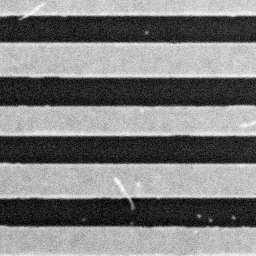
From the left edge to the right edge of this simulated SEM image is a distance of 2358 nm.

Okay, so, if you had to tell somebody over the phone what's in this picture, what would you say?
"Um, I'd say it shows lines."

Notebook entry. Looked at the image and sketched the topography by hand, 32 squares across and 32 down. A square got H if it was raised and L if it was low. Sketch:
HHHHHHHHHHHHHHHHHHHHHHHHHHHHHHHH
HHHHHHHHHHHHHHHHHHHHHHHHHHHHHHHH
LLLLLLLLLLLLLLLLLLLLLLLLLLLLLLLL
LLLLLLLLLLLLLLLLLLLLLLLLLLLLLLLL
LLLLLLLLLLLLLLLLLLLLLLLLLLLLLLLL
HHHHHHHHHHHHHHHHHHHHHHLHHHHHHHHH
HHHHHHHHHHHHHHHHHHHHHHHHHHHHHHHH
HHHHHHHHHHHHHHHHHHHHHHHHHHHHHHHH
HHHHHHHHHHHHHHHHHHHHHHHHHHHHHHHH
LLLLLLLLLLLLLLLLLLLLHHHHHHHHHHHH
LLLLLLLLLLLLLLLLLLLLLLLLLLLLLLLL
LLLLLLLLLLLLLLLLLLLLLLLLLLLLLLLL
LLLLLLLLLLLLLLLLLLLLLLLLLLLLLLLL
HHHHHHHHHHHHHHHHHHHHHHHHHHHHHHHH
HHHHHHHHHHHHHHHHHHHHHHHHHHHHHHHH
HHHHHHHHHHHHHHHHHHHHHHHHHHHHHHHH
HHHHHHHHHHHHHHHHHHHHHHHHHHHHHHHH
LLLLLLLLLLLLLLLLLLLLLLLLLLLLLLLL
LLLLLLLLLLLLLLLLLLLLLLLLLLLLLLLL
LLLLLLLLLLLLLLLLLLLLLLLLLLLLLLLL
LLLLLLLLLLLLLLLLLLLLLLLLLLLLLLLL
HHHHHHHHHHHHHHHHHHHHHHHHHHHHHHHH
HHHHHHHHHHHHHHHHHHHHHHHHHHHHHHHH
HHHHHHHHHHHHHHHHHHHHHHHHHHHHHHHH
HHHHHHHHHHHHHHHHHHHHHHHHHHHHHHHH
LLLLLLLLLLLLLLLLLLLLLLLLLLLLLLLL
LLLLLLLLLLLLLLLLLLLLLLLLLLLLLLLL
LLLLLLLLLLLLLLLLLLLLLLLLLLLLLLLL
HHHHHHHHHHHHHHHHHHHHHHHHLHHHLLHL
HHHHHHHHHHHHHHHHHHHHHHHHHHHHHHHH
HHHHHHHHHHHHHHHHHHHHHHHHHHHHHHHH
HHHHHHHHHHHHHHHHHHHHHHHHHHHHHHHH